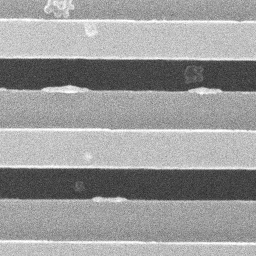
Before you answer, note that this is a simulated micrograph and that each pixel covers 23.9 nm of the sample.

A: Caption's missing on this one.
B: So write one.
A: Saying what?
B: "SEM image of lines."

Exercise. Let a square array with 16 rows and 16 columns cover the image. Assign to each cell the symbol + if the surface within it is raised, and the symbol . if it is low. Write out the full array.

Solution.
++++++++++++++++
++++++++++++++++
++++++++++++++++
++++++++++++++++
................
...++...........
++++++++++++++++
++++++++++++++++
++++++++++++++++
++++++++++++++++
.........+++++++
................
.....+++........
++++++++++++++++
++++++++++++++++
++++++++++++++++